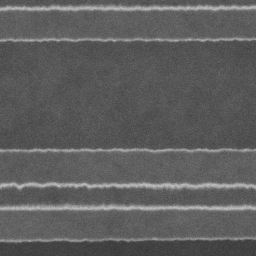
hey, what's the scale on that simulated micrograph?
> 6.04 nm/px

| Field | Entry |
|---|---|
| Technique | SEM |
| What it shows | lines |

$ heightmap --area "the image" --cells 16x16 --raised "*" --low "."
****************
****************
***.*.**..****..
................
................
................
................
................
................
****************
****************
****************
****************
****************
****************
................